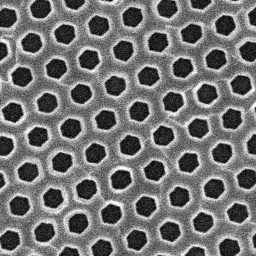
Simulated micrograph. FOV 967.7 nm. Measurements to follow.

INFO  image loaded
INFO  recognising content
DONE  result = a regular array of holes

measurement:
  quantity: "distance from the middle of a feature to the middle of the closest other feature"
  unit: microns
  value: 0.131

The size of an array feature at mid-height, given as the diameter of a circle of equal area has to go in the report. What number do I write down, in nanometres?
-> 78.9